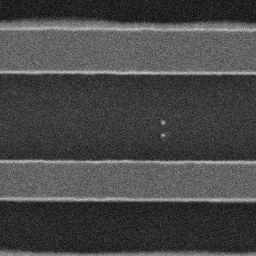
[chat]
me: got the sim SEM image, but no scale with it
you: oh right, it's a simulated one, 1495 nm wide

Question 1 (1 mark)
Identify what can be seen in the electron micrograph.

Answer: lines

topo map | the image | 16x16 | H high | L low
LLLLLLLLLLLLLLLL
LLLLLLLLLLLLLLLL
HHHHHHHHHHHHHHHH
HHHHHHHHHHHHHHHH
HHHHHHHHHHHHHHHH
LLLLLLLLLLLLLLLL
LLLLLLLLLLLLLLLL
LLLLLLLLLLLLLLLL
LLLLLLLLLLLLLLLL
LLLLLLLLLLLLLLLL
HHHHHHHHHHHHHHHH
HHHHHHHHHHHHHHHH
LLLLLLLLLLLHLHLL
LLLLLLLLLLLLLLLL
LLLLLLLLLLLLLLLL
LLLLLLLLLLLLLLLL